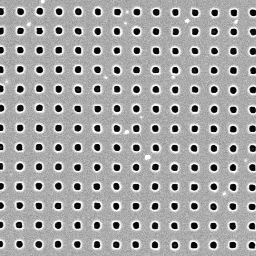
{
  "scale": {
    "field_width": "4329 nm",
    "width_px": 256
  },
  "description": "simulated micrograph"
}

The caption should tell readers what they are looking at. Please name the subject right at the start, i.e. a regular array of holes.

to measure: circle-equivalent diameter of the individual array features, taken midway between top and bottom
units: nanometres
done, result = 124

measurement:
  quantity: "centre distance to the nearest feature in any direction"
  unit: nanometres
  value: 321